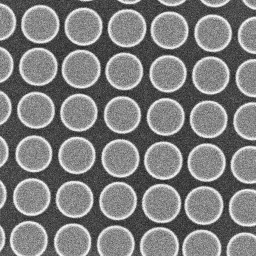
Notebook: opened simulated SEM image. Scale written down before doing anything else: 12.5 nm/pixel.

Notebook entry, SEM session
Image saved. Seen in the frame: an array of small figures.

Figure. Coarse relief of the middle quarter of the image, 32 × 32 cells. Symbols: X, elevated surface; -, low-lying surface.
XXXXXXXXX--XXXXXXXX---XXXXXXXX--
XXXXXXXXX--XXXXXXXXX--XXXXXXXXX-
XXXXXXXXX-XXXXXXXXXX--XXXXXXXXX-
XXXXXXXX---XXXXXXXX---XXXXXXXX--
-XXXXXXX---XXXXXXXX---XXXXXXXX--
--XXXX------XXXXXX-----XXXXXX---
------------------------XXXX----
--------------------------------
-XXXXX-------XXX----------------
XXXXXXXX---XXXXXXX-----XXXXX----
XXXXXXXX---XXXXXXXX---XXXXXXX---
XXXXXXXX--XXXXXXXXX--XXXXXXXXX--
XXXXXXXX--XXXXXXXXX--XXXXXXXXX--
XXXXXXXX--XXXXXXXXX--XXXXXXXXX--
XXXXXXX---XXXXXXXXX--XXXXXXXXX--
-XXXXXX----XXXXXXX---XXXXXXXX---
--XXX-------XXXXX-----XXXXXXX---
------------------------XXX-----
--XXX---------------------------
XXXXXX------XXXX--------X-------
XXXXXXX----XXXXXXX----XXXXXX----
XXXXXXXX--XXXXXXXX---XXXXXXXX---
XXXXXXXX--XXXXXXXXX-XXXXXXXXX--X
XXXXXXXX--XXXXXXXXX-XXXXXXXXX--X
XXXXXXX---XXXXXXXXX-XXXXXXXXX--X
XXXXXXX---XXXXXXXX--XXXXXXXXX--X
XXXXXX-----XXXXXXX---XXXXXXXX--X
-----------XXXXXX----XXXXXXX----
-----------------------XXXX-----
-XX-----------------------------
XXXXXX-----XXXXX------XXXX------
XXXXXXX---XXXXXXX----XXXXXXX----